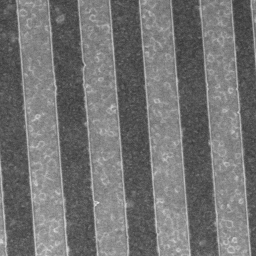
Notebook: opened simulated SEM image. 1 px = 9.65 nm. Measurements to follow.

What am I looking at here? parallel lines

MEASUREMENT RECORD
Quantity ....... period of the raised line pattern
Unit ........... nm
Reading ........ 584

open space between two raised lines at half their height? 296 nanometres